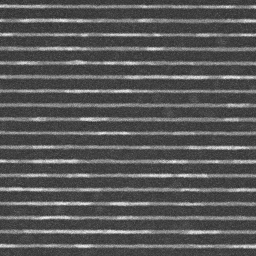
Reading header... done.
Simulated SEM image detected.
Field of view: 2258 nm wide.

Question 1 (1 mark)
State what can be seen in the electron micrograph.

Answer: parallel lines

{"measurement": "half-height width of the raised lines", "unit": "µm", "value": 0.0254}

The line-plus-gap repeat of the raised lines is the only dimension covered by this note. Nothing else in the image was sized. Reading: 124 nm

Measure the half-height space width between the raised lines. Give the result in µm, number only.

0.101